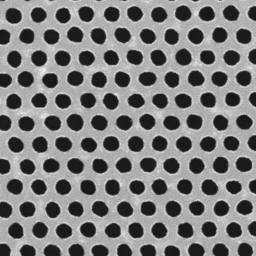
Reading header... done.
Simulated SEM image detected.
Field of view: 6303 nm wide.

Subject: a regular array of holes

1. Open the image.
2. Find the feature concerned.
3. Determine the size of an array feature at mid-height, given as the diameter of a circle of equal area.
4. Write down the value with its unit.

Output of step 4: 394 nm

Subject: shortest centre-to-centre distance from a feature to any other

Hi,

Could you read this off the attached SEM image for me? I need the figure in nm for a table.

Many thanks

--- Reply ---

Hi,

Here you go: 579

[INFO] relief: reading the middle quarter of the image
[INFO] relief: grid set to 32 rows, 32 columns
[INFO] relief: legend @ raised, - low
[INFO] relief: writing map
-@@@@@@@@@@@@@@@@@@@@@@-@@@@@@@@
@@@@@@@@@@@@@@@@@@@@@@@@@@@@@@@@
@----@@---@@@---@@@----@@@--@@@-
@----@@----@@---@@@----@@----@@-
@----@@----@@---@@@----@@----@@-
@@-@@@@---@@@@--@@@@-@@@@@--@@@@
@@@@@@@@@@@@@@@@@@@@@@@@@@@@@@@@
@@@@@--@@@@-@@@@@@-@@@@--@@@---@
--@@----@@---@@@----@@----@@----
--@@----@@----@@----@@----@@----
-@@@@--@@@---@@@@---@@@---@@----
@@@@@@@@@@@@@@@@@@@@@@@@@@@@@@@@
@@-@@@@@@@@@@@@@@@@@-@@@@@@@@@@@
@----@@---@@@----@@----@@---@@@-
@----@@----@@----@@----@@----@@-
@----@@----@@----@@----@@----@@-
@@--@@@@--@@@@@-@@@@@@@@@@--@@@@
@@@@@@@@@@@@@@@@@@@@@@@@@@@@@@@@
-@@@@--@@@---@@@@--@@@@--@@@@--@
--@@----@@----@@----@@----@@----
--@@----@@----@@----@@----@@----
--@@@---@@@--@@@@--@@@@--@@@@--@
@@@@@@@@@@@@@@@@@@@@@@@@@@@@@@@@
@@-@@@@@@@@@@@@-@@@@--@@@@--@@@@
@---@@@---@@@----@@----@@----@@-
@----@@----@@----@@----@@----@@-
@----@@----@@----@@@---@@----@@-
@@@@@@@@@@@@@@@@@@@@@@@@@@@-@@@@
@@@@@@@@@@@@@@@@@@@@@@@@@@@@@@@@
-@@@---@@@@--@@@@--@@@---@@@@---
--@@----@@----@@----@@----@@----
--@@----@@----@@----@@----@@----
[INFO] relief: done